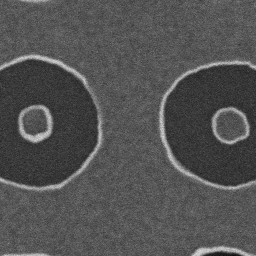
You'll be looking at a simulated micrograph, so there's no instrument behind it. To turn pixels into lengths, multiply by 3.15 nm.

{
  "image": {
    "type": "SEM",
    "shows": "ring-shaped grooves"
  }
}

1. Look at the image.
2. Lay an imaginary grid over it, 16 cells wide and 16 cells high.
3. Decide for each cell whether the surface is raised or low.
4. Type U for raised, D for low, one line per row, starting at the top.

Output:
UUUUUUUUUUUUUUUU
UUUUUUUUUUUUUUUU
UUUUUUUUUUUUUUUU
UUUUUUUUUUUUUUUU
DDDDUUUUUUUUDDDD
DDDDDUUUUUUDDDDD
DDDDDDUUUUDDDDDD
DUUDDDUUUUDDDUUD
DUUDDDUUUUDDDDUD
DDDDDDUUUUUDDDDD
DDDDDUUUUUUUDDDD
UDDUUUUUUUUUUUDU
UUUUUUUUUUUUUUUU
UUUUUUUUUUUUUUUU
UUUUUUUUUUUUUUUU
UUUUUUUUUUUUUUUU